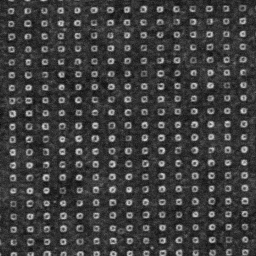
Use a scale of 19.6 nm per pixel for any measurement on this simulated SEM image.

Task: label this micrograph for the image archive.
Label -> a regular array of raised bodies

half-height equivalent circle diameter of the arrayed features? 113 nanometers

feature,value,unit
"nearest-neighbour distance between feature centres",247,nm